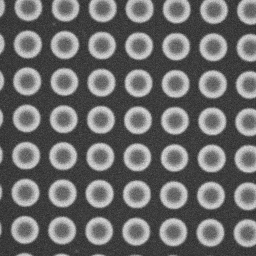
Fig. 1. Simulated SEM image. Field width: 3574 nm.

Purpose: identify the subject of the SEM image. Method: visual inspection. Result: an array of small figures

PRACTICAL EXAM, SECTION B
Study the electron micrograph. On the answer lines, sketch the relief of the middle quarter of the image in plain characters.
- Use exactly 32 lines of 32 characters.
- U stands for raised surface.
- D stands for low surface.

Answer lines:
DDDDDDDDDDDDDDDDDDDDDDDDDDDDDDDD
UUDDDDDDUUUDDDDDDDDDDDDDDDDDDDDD
UUUDDDDUUUUUDDDDUUUUUDDDDDUUUUDD
UUUDDDUUUUUUUDDDUUUUUUDDDUUUUUUD
UUUDDDUUUUUUUDDUUUUUUUDDDUUUUUUD
UUUDDDUUUUUUUDDUUUUUUUDDDUUUUUUD
UUUDDDUUUUUUDDDDUUUUUUDDDUUUUUUD
UUDDDDDDUUUDDDDDDUUUUDDDDDUUUUDD
DDDDDDDDDDDDDDDDDDDDDDDDDDDDDDDD
DDDDDDDDDDDDDDDDDDDDDDDDDDDDDDDD
DDDDDDDDDDDDDDDDDDDDDDDDDDDDDDDD
UUDDDDDUUUUUDDDDUUUUUDDDDDUUUUDD
UUUDDDUUUUUUDDDUUUUUUDDDDUUUUUUD
UUUDDDUUUUUUUDDUUUUUUUDDUUUUUUUD
UUUDDDUUUUUUDDDUUUUUUUDDUUUUUUUD
UUUDDDUUUUUUDDDUUUUUUUDDDUUUUUUD
UUDDDDDUUUUUDDDDUUUUUDDDDUUUUUDD
DDDDDDDDDDDDDDDDDDDDDDDDDDDDDDDD
DDDDDDDDDDDDDDDDDDDDDDDDDDDDDDDD
DDDDDDDDDDDDDDDDDDDDDDDDDDDDDDDD
UUDDDDDUUUUDDDDDUUUUDDDDDDUUUDDD
UUUDDDUUUUUUDDDDUUUUUDDDDUUUUUDD
UUUDDDUUUUUUDDDUUUUUUUDDDUUUUUUD
UUUDDDUUUUUUDDDUUUUUUUDDUUUUUUUD
UUUDDDUUUUUUDDDUUUUUUDDDUUUUUUUD
UUDDDDDUUUUUDDDDUUUUUDDDDUUUUUDD
DDDDDDDDUUDDDDDDDUUUDDDDDDUUUDDD
DDDDDDDDDDDDDDDDDDDDDDDDDDDDDDDD
DDDDDDDDDDDDDDDDDDDDDDDDDDDDDDDD
UDDDDDDUUUUDDDDDDUUUDDDDDDDUDDDD
UUDDDDUUUUUUDDDDUUUUUDDDDUUUUUDD
UUUDDDUUUUUUDDDUUUUUUDDDUUUUUUUD